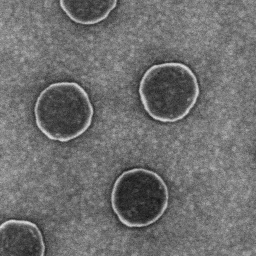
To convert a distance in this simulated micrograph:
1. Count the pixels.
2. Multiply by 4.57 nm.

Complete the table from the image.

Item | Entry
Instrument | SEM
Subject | raised bodies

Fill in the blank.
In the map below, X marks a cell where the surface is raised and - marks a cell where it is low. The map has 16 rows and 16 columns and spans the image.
----XXX---------
----------------
----------------
----------------
---------XXX----
---XX----XXX----
--XXXX---XXX----
--XXXX----X-----
---XX-----------
----------------
----------------
-------XXX------
-------XXX------
-------XXX------
XX--------------
XXX-------------